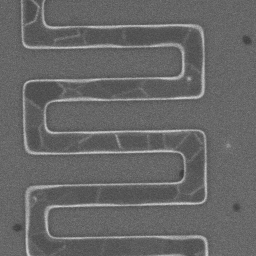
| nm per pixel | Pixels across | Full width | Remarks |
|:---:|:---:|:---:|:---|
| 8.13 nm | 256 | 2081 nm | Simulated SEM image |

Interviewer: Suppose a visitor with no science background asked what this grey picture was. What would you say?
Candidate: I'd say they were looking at groups of lines, slits or small figures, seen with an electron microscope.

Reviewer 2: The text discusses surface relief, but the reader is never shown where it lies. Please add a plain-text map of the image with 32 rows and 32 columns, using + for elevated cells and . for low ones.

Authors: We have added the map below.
...++...........................
...++...........................
...++...........................
...++++++++++++++++++++++.......
...++++++++++++++++++++++.......
...++++++++++++++++++++++.......
.......................++.......
.......................++.......
.......................++.......
.......................++.......
...++++++++++++++++++++++.......
...++++++++++++++++++++++.......
...+++++........................
...+++..........................
...+++..........................
...+++..........................
...+++...............++++.......
...+++++++++++++++++++++++......
...+++++++++++++++++++++++......
.......................+++......
.......................+++......
.......................+++......
.......................+++......
.....+++++++++++++++++++++......
....++++++++++++++++++++++......
....+++++++++++++++.............
....++..........................
....++..........................
...+++..........................
...+++..........................
...+++++++++++++++++++++++......
....++++++++++++++++++++++......